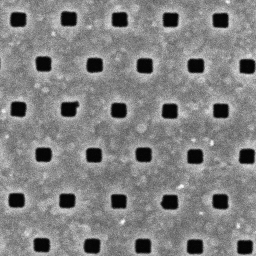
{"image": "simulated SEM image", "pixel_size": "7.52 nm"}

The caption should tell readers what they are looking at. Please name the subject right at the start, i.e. a regular array of holes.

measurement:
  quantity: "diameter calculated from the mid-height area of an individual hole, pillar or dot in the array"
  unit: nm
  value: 129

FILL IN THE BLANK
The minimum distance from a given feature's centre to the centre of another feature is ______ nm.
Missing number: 379